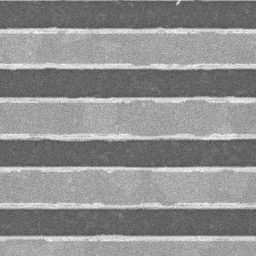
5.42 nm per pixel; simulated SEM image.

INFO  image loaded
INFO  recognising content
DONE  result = one or a few lines or trenches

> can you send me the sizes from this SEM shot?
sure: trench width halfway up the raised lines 31.4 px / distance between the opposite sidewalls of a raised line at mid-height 37.7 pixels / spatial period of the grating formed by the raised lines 0.376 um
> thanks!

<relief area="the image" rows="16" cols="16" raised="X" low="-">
----------------
----------------
XXXXXXXXXXXXXXXX
XXXXXXXXXXXXXXXX
----------------
----------------
XXXXXXXXXXXXXXXX
XXXXXXXXXXXXXXXX
XXXXXXXXXXXXXXXX
----------------
----------------
XXXXXXXXXXXXXXXX
XXXXXXXXXXXXXXXX
----------------
----------------
XXXXXXXXXXXXXXXX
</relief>